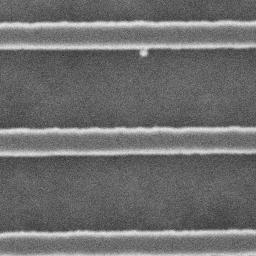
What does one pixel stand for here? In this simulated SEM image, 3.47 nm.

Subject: lines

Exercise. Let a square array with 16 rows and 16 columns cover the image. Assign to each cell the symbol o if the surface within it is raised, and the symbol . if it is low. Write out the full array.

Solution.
................
..oooooooooooooo
oooooooooooooooo
................
................
................
................
................
oooooooooooooooo
oooooooooooooooo
................
................
................
................
.....ooooooooooo
oooooooooooooooo